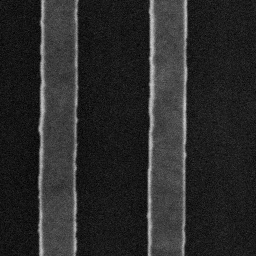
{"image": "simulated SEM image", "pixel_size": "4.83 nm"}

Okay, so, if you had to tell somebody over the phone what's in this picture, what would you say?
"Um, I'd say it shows lines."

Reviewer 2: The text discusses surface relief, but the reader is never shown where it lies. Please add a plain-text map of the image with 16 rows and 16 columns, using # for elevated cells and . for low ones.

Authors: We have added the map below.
...##....###....
...##....###....
...##....###....
...##....###....
...##....###....
...##....###....
...##....###....
...##....###....
..###....###....
...##....###....
..###....###....
..###....###....
..###....###....
...##....###....
..###....###....
...##....###....